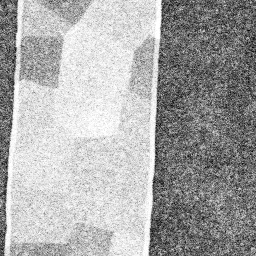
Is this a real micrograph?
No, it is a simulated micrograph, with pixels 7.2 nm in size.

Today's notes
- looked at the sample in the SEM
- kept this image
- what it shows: one or a few lines or trenches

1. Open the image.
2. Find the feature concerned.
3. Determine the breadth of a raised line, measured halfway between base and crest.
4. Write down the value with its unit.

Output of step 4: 0.996 um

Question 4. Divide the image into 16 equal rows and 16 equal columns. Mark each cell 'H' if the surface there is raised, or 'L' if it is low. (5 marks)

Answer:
LHHHHHHHHHLLLLLL
LHHHHHHHHHLLLLLL
LHHHHHHHHHLLLLLL
LHHHHHHHHHLLLLLL
LHHHHHHHHHLLLLLL
LHHHHHHHHHLLLLLL
LHHHHHHHHHLLLLLL
LHHHHHHHHHLLLLLL
LHHHHHHHHHLLLLLL
LHHHHHHHHHLLLLLL
LHHHHHHHHLLLLLLL
LHHHHHHHHLLLLLLL
LHHHHHHHHLLLLLLL
LHHHHHHHHLLLLLLL
LHHHHHHHHLLLLLLL
HHHHHHHHHLLLLLLL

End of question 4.